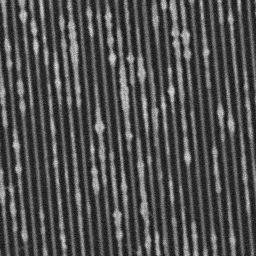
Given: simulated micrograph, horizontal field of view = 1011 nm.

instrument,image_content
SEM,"parallel lines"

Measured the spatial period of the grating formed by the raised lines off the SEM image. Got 37.1 nm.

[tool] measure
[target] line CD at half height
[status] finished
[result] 10.8 nm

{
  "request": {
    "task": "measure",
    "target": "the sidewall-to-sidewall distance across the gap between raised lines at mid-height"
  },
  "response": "26.1 nanometers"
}